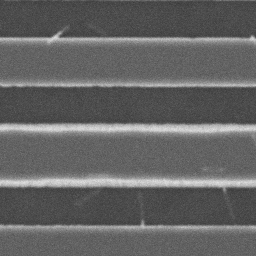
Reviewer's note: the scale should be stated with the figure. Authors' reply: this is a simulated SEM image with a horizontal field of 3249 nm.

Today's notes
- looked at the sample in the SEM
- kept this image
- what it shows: lines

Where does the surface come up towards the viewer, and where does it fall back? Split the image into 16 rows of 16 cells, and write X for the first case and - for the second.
----------------
----------------
XXXXXXXXXXXXXXXX
XXXXXXXXXXXXXXXX
XXXXXXXXXXXXXXXX
----------------
----------------
----------------
XXXXXXXXXXXXXXXX
XXXXXXXXXXXXXXXX
XXXXXXXXXXXXXXXX
XXXXXX-XXXXXXXXX
----------------
----------------
XXXXXXXXXXXXXXXX
XXXXXXXXXXXXXXXX